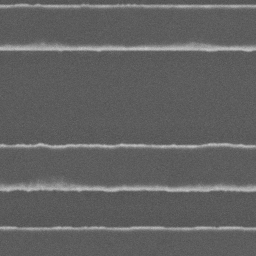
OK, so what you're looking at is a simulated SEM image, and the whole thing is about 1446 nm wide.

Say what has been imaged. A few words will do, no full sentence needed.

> lines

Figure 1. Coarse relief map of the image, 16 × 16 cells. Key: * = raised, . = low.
****************
****************
****************
................
................
................
................
................
................
****************
****************
****************
................
................
****************
****************